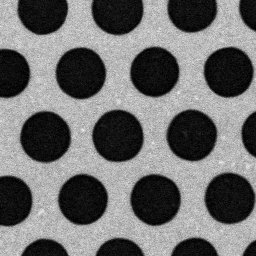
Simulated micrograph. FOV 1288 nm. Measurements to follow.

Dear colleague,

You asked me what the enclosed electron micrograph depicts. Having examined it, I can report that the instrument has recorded a regular array of holes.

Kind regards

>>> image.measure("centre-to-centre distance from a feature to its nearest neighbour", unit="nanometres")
366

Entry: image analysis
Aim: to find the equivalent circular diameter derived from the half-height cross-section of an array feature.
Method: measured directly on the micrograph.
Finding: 253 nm